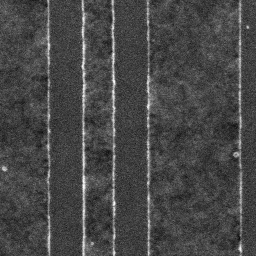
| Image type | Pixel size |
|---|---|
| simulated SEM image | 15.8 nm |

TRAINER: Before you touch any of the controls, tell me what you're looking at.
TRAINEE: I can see lines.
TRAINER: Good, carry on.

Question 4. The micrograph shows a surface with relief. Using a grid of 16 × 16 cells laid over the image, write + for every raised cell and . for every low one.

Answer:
+++..++..++++++.
+++..++..++++++.
+++..++..++++++.
+++..++..++++++.
+++..++..++++++.
+++..++..++++++.
+++..++..++++++.
+++..++..++++++.
+++..++..++++++.
+++..++..++++++.
+++..++..++++++.
+++..++..++++++.
+++..++..++++++.
+++..++..++++++.
+++..++..++++++.
+++..++..++++++.